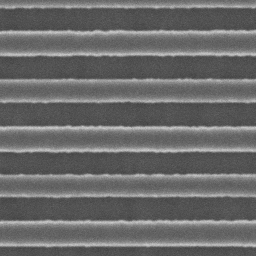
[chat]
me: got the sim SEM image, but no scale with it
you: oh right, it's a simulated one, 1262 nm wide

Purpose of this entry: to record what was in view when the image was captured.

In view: lines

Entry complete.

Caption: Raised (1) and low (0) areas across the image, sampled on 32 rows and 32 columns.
11111111111111111111111111111111
00000000000000000000000000000000
00000000000000000000000000000000
00000000000000000000000000000000
11111111111111111111111111111111
11111111111111111111111111111111
11111111111111111111111111111111
00000000000000000000000000000000
00000000000000000000000000000000
00000000000000000000000000000000
11111111111111111111111111111111
11111111111111111111111111111111
11111111111111111111111111111111
00000000000000000000000000000000
00000000000000000000000000000000
00000000000000000000000000000000
11111111111111111111111111111111
11111111111111111111111111111111
11111111111111111111111111111111
00000000000000000000000000000000
00000000000000000000000000000000
00000000000000000000000000000000
11111111111111111111111111111111
11111111111111111111111111111111
11111111111111111111111111111111
00000000000000000000000000000000
00000000000000000000000000000000
00000000000000000000000000000000
11111111111111111111111111111111
11111111111111111111111111111111
11111111111111111111111111111111
00000000000000000000000000000000